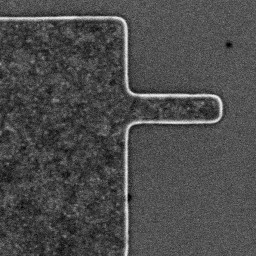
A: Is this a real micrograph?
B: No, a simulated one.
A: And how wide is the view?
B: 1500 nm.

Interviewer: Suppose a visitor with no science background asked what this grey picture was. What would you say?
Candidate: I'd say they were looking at wiring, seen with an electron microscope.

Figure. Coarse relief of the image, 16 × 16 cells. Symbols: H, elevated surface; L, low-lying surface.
LLLLLLLLLLLLLLLL
HHHHHHHHLLLLLLLL
HHHHHHHHLLLLLLLL
HHHHHHHHLLLLLLLL
HHHHHHHHLLLLLLLL
HHHHHHHHLLLLLLLL
HHHHHHHHHHHHHHLL
HHHHHHHHHHHHHLLL
HHHHHHHHLLLLLLLL
HHHHHHHHLLLLLLLL
HHHHHHHHLLLLLLLL
HHHHHHHHLLLLLLLL
HHHHHHHHLLLLLLLL
HHHHHHHHLLLLLLLL
HHHHHHHHLLLLLLLL
HHHHHHHHLLLLLLLL